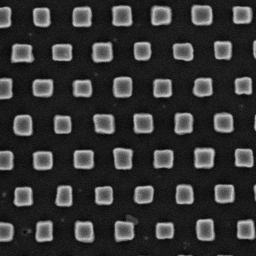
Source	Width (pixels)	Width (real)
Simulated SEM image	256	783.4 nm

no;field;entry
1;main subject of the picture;a regular array of raised bodies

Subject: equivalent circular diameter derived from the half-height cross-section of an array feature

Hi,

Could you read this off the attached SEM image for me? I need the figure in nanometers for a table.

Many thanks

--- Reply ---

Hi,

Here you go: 60.3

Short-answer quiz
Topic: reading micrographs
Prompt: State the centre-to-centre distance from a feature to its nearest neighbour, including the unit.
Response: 122 nanometres